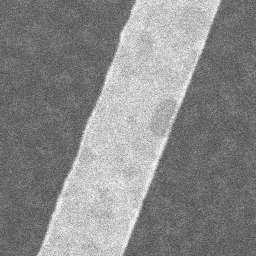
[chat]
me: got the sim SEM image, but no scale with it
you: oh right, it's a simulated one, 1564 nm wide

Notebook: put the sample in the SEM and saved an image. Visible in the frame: one or a few lines or trenches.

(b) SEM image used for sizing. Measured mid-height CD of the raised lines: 471 nm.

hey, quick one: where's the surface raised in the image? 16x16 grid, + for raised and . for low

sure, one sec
........++++++..
........+++++...
........+++++...
.......+++++....
.......+++++....
.......+++++....
......+++++.....
......+++++.....
.....+++++......
.....+++++......
.....+++++......
....+++++.......
....+++++.......
...++++++.......
...+++++........
...+++++........